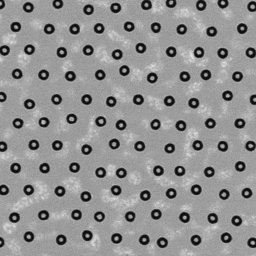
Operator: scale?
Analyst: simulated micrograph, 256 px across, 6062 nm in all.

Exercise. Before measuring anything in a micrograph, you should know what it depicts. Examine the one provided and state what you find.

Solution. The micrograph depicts a regular array of ring-shaped grooves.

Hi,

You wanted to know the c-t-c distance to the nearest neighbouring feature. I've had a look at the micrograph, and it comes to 563 nm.